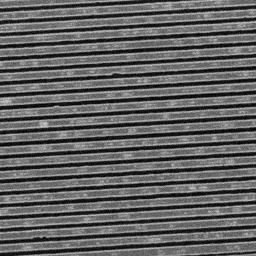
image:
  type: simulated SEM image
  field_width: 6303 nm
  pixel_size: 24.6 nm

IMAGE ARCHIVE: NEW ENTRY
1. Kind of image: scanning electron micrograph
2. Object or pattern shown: parallel lines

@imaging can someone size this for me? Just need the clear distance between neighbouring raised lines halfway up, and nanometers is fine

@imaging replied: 117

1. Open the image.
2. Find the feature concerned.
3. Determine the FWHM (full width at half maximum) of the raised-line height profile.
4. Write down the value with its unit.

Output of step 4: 184 nanometers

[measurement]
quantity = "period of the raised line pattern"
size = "301 nm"